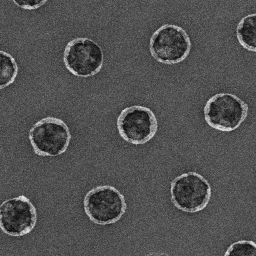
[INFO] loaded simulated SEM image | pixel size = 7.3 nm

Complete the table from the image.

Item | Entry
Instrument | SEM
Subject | raised bodies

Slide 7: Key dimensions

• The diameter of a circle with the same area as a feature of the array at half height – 286 nm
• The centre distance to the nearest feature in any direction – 631 nm